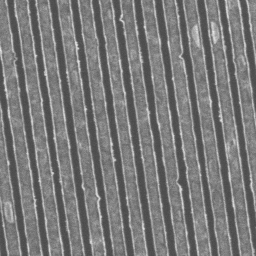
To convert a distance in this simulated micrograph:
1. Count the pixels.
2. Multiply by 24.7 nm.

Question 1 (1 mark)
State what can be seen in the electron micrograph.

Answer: parallel lines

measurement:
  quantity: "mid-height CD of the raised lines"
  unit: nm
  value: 224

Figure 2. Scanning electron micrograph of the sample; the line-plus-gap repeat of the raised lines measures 20.9 px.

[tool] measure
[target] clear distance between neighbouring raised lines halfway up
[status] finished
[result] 291 nm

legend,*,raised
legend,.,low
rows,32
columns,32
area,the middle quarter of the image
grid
*...**...**...**...***...**...**
*...**...**...***..***...**...**
*...**...**...***...**...**...**
*...**...***..***...**...**....*
*...**....**...**...**...**....*
*...***...**...**...**....**...*
**...**...**...**...***...**...*
**...**...**...**....**...**...*
**...**...**...***..***...**...*
**...**...**...***...**...**...*
**...**...***..***...**...**....
**...**....**...**...**...**....
**...***...**...**...**...***...
***...**...**...**...**....**...
***...**...**...**...***...**...
***...**...**...***..***...**...
.**...**...**...***...**...**...
.**...**...***..***...**...**...
.**...**....**...**...**...**...
.**...***...**...**...**...***..
.**...***...**...**...**....**..
.***...**...**...**...***...**..
.***...**...**...***..***...**..
..**...**...**...***...**...**..
..**...**...***..***...**...**..
..**...**....**...**...**...***.
..**...***...**...**...**...***.
..**...***...**...**...**....**.
..***...**...**...**...***..***.
..***...**...**...***..***..***.
...**...**...**...***...**...**.
...**...**...***..***...**...**.